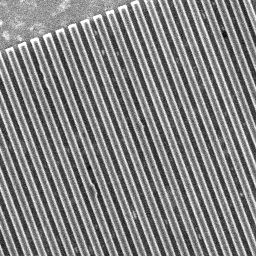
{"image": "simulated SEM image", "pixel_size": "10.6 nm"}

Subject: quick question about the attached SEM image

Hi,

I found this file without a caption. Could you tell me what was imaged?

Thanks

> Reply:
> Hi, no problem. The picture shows parallel lines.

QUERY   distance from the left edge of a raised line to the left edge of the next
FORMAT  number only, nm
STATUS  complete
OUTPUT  142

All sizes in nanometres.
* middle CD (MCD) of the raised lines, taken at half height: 81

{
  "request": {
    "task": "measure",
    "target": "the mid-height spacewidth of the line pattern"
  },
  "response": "63.6 nm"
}